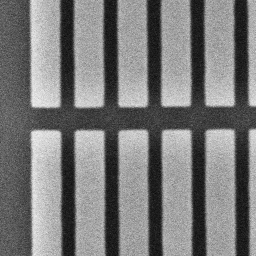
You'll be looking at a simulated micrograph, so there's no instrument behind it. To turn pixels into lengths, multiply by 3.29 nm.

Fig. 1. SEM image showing groups of lines, slits or small figures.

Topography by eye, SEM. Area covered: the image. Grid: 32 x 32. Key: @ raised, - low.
----@@@--@@@@--@@@--@@@@--@@@--@
----@@@--@@@@--@@@--@@@@--@@@--@
----@@@--@@@@--@@@--@@@@--@@@--@
----@@@--@@@@--@@@--@@@@--@@@--@
----@@@--@@@@--@@@--@@@@--@@@--@
----@@@--@@@@--@@@--@@@@--@@@--@
----@@@--@@@@--@@@--@@@@--@@@--@
----@@@--@@@@--@@@--@@@@--@@@--@
----@@@--@@@@--@@@--@@@@--@@@--@
----@@@--@@@@--@@@--@@@@--@@@--@
----@@@--@@@@--@@@--@@@@--@@@--@
----@@@--@@@@--@@@--@@@@--@@@--@
----@@@--@@@@--@@@--@@@@--@@@--@
--------------------------------
--------------------------------
--------------------------------
----@@@---@@@--@@@--@@@@--@@@--@
----@@@@-@@@@--@@@--@@@@--@@@--@
----@@@@-@@@@--@@@--@@@@--@@@--@
----@@@@-@@@@--@@@--@@@@--@@@--@
----@@@@-@@@@--@@@--@@@@--@@@--@
----@@@@--@@@--@@@--@@@@--@@@--@
----@@@@--@@@--@@@--@@@@--@@@--@
----@@@@--@@@--@@@--@@@@--@@@--@
----@@@@--@@@--@@@--@@@@--@@@--@
----@@@@--@@@--@@@--@@@@--@@@--@
----@@@@--@@@--@@@--@@@@--@@@--@
----@@@@--@@@--@@@--@@@@--@@@--@
----@@@@--@@@--@@@--@@@@--@@@--@
----@@@@--@@@--@@@--@@@@--@@@--@
----@@@@--@@@--@@@--@@@@--@@@--@
----@@@@--@@@--@@@--@@@@--@@@--@